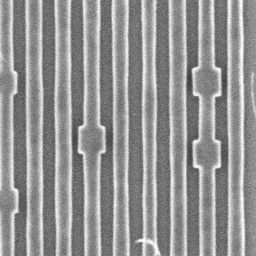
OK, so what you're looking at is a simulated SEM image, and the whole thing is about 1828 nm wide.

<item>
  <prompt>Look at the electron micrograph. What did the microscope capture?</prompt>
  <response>wiring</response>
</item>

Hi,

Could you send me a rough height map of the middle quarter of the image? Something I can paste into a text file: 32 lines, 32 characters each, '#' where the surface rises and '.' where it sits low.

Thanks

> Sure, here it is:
##...####...####....###....###..
##...####...####....###....###..
#....####....###....###....###..
#....####....###....###....###..
#....####....###....###....###..
#....####....###....###....###..
#....####....###....###....###..
##...####....###....###....###..
##...####....###....###....###..
##...####....###....###....###..
##...####....###....###....###..
##...####....###....###....###..
##...####....###....###....###..
##...####....###....###....###..
##...####....###....###....###..
##...####....###....###....###..
##..######...###....###....###..
##..######...###....###....###..
##..######...###....###....###..
##..######...###....###....###..
##..######...###....###....###..
##..######...###....###....###..
##...####....###....###....###..
##...####....###....###....###..
##...####....###....###....###..
##...####....###....###....###..
##...####....###....###....###..
##...####....###....###....###..
##...####....###....###....###..
##...####....###....###....###..
##...####....###....###....###..
##...####....###....###....###..